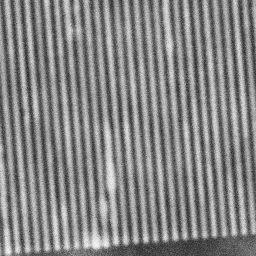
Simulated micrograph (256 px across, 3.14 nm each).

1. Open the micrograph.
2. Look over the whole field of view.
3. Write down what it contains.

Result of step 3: parallel lines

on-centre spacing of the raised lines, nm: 31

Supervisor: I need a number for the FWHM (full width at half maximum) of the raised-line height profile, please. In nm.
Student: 13.7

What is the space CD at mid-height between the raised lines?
16.4 nanometres